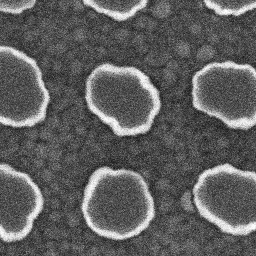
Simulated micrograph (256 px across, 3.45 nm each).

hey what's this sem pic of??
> raised bodies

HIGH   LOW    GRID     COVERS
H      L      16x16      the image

HHLLLLHHHLLLLHHH
LLLLLLLLLLLLLLLL
LLLLLLLLLLLLLLLL
HHLLLLLLLLLLLLLL
HHLLLLHHHLLLHHHH
HHHLLHHHHHLLHHHH
HHHLLHHHHHLLHHHH
HHLLLLHHHHLLLLHH
LLLLLLLLLLLLLLLL
LLLLLLLLLLLLLLLL
LLLLLLLLLLLLLHHL
HHLLLLHHHLLLHHHH
HHHLLHHHHLLLHHHH
HHLLLHHHHHLLLHHH
HHLLLLHHHLLLLLHL
LLLLLLLLLLLLLLLL